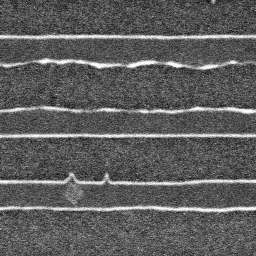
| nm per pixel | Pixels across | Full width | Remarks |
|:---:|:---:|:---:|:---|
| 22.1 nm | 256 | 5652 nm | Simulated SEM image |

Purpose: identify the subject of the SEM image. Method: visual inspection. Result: one or a few lines or trenches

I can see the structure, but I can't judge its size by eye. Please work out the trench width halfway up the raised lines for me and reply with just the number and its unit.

996 nm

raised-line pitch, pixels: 72.5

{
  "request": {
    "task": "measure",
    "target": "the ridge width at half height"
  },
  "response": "0.594 microns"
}